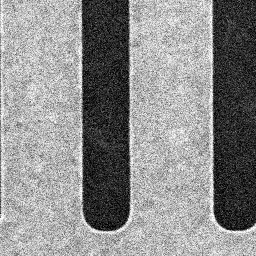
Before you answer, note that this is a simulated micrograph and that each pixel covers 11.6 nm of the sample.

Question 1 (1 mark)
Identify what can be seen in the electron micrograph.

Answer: one or a few lines or trenches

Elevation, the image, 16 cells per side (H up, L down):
HHHHHLLLHHHHHLLL
HHHHHLLLHHHHHLLL
HHHHHLLLHHHHHLLL
HHHHHLLLHHHHHLLL
HHHHHLLLHHHHHLLL
HHHHHLLLHHHHHLLL
HHHHHLLLHHHHHLLL
HHHHHLLLHHHHHLLL
HHHHHLLLHHHHHLLL
HHHHHLLLHHHHHLLL
HHHHHLLLHHHHHLLL
HHHHHLLLHHHHHLLL
HHHHHLLLHHHHHLLL
HHHHHLLLHHHHHLLL
HHHHHHHHHHHHHHHH
HHHHHHHHHHHHHHHH